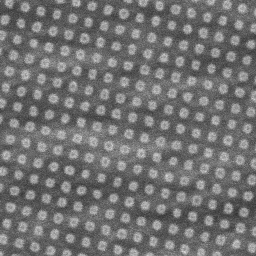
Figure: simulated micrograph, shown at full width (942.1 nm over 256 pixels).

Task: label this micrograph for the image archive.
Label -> a regular array of raised bodies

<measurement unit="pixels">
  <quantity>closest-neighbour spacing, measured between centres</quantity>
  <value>16.2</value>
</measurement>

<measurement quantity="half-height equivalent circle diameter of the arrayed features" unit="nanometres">30.5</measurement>